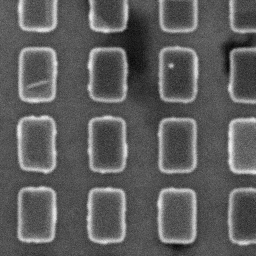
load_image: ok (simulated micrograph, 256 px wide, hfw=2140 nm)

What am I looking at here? wiring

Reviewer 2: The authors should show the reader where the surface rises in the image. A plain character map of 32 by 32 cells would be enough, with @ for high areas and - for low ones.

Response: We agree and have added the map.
---@@@@-----@@@@----@@@@-----@@@
---@@@@-----@@@@----@@@@-----@@@
---@@@@-----@@@@----@@@@-----@@@
---@@@------@@@------@@@-----@@@
--------------------------------
--------------------------------
---@@@------@@@-----@@@@-----@@@
---@@@@----@@@@@----@@@@-----@@@
---@@@@----@@@@@----@@@@-----@@@
---@@@@----@@@@@----@@@@-----@@@
---@@@@----@@@@@----@@@@-----@@@
---@@@@----@@@@-----@@@@-----@@@
------------@@@------@@@-----@@@
--------------------------------
--------------------------------
---@@@@----@@@@-----@@@@-----@@@
---@@@@----@@@@-----@@@@-----@@@
---@@@@----@@@@-----@@@@-----@@@
---@@@@----@@@@-----@@@@-----@@@
---@@@@----@@@@-----@@@@-----@@@
---@@@@----@@@@-----@@@@-----@@@
--------------------------------
--------------------------------
--------------------------------
---@@@@----@@@@-----@@@@-----@@@
---@@@@----@@@@-----@@@@-----@@@
---@@@@----@@@@-----@@@@-----@@@
---@@@@----@@@@-----@@@@-----@@@
---@@@@----@@@@-----@@@@-----@@@
---@@@@----@@@@-----@@@@-----@@@
--------------------------------
--------------------------------